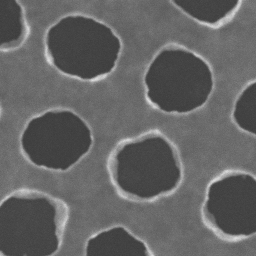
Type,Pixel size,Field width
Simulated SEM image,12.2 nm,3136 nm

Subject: holes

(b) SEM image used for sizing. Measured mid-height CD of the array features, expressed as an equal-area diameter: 811 nanometers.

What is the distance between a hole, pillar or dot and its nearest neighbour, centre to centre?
1.15 µm